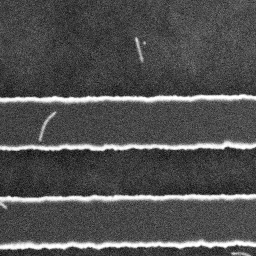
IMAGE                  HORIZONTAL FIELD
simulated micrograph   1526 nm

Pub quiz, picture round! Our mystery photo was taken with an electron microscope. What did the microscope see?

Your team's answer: lines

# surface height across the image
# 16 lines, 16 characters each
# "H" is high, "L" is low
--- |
LLLLLLLLLLLLLLLL
LLLLLLLLLLLLLLLL
LLLLLLLLLLLLLLLL
LLLLLLLLLLLLLLLL
LLLLLLLLLLLLLLLL
LLLLLLLLLLLLLLLL
HHHHHHHHHHHHHHHH
HHHHHHHHHHHHHHHH
HHHHHHHHHHHHHHHH
LLLLLLLLLLLLLLLL
LLLLLLLLLLLLLLLL
LLLLLLLLLLLLLLLL
HHHHHHHHHHHHHHHH
HHHHHHHHHHHHHHHH
HHHHHHHHHHHHHHHH
LLLLLLLLLLLLLLLL